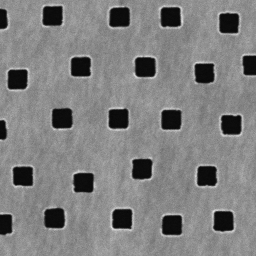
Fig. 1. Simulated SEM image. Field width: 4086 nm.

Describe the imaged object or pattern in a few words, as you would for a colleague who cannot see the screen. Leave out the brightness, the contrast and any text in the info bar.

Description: a regular array of holes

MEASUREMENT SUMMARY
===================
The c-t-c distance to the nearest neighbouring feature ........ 52.3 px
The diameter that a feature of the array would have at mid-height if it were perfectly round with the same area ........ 354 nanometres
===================